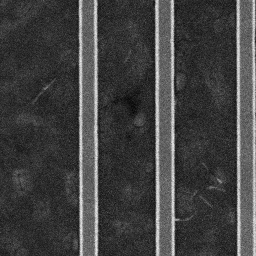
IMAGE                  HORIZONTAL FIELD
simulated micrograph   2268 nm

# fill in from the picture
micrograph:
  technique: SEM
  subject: one or a few lines or trenches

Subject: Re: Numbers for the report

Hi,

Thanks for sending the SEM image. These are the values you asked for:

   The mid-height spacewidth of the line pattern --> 560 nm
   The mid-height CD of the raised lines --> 0.142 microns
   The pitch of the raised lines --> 78.9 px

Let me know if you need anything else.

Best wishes